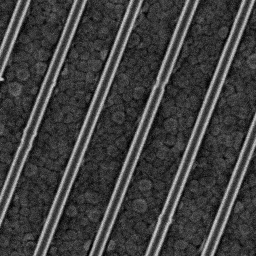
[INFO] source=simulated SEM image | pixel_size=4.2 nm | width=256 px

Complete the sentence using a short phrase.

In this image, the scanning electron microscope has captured parallel lines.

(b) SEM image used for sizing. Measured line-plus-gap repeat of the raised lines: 220 nm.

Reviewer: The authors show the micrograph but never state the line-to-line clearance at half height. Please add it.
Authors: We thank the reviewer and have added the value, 179 nm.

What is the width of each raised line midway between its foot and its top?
41.7 nm